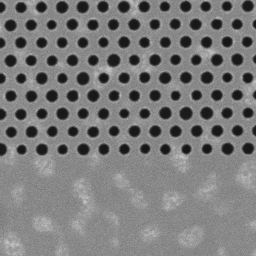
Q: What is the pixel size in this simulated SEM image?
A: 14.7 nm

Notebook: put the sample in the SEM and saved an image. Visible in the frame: a regular array of holes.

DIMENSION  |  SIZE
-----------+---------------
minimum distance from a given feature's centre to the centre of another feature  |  0.297 microns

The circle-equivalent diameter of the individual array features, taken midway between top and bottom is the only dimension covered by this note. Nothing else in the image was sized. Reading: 173 nm